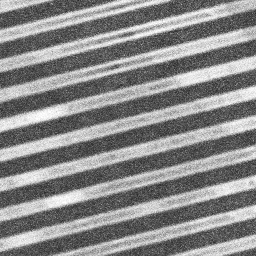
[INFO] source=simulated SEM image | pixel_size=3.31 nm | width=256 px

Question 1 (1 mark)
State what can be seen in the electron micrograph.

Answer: parallel lines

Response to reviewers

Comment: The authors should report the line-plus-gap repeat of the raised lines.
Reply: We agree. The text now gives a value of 95.9 nm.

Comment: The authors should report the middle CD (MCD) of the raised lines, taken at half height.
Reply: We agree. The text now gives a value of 10.9 px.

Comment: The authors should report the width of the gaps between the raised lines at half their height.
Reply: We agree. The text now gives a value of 59.1 nm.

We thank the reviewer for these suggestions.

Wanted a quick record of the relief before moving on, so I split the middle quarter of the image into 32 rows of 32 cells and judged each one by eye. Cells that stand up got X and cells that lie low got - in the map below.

--------XXX-----XXX-------------
----XXX------XX-----------------
XXXXX---XXX-------------------XX
XXXXXXX-------------------XXXXXX
XXX--------------------XXXXXXXXX
-------------------XXXXXXXXXXX--
--------------XXXXXXXXXXXX------
----------XXXXXXXXXXXX----------
------XXXXXXXXXXXX--------------
---XXXXXXXXXXX------------------
XXXXXXXXXX------------------XXXX
XXXXXX------------------XXXXXXXX
XX------------------XXXXXXXXXXX-
----------------XXXXXXXXXXX-----
------------XXXXXXXXXXX---------
--------XXXXXXXXXXX-------------
----XXXXXXXXXXX-----------------
XXXXXXXXXXX-------------------XX
XXXXXXX-------------------XXXXXX
XXX-------------------XXXXXXXXXX
------------------XXXXXXXXXXX---
--------------XXXXXXXXXXX-------
----------XXXXXXXXXXX-----------
------XXXXXXXXXXX---------------
--XXXXXXXXXXX-------------------
XXXXXXXXX-------------------XXXX
XXXXX-------------------XXXXXXXX
X-------------------XXXXXXXXXXX-
----------------XXXXXXXXXXX-----
-----------XXXXXXXX-XXX---------
-------XXXXXXXXXXXX-------------
----XXXXXXXXXXX-----------------